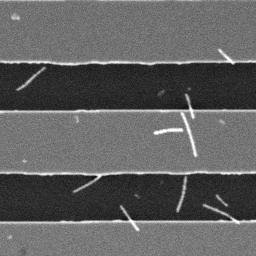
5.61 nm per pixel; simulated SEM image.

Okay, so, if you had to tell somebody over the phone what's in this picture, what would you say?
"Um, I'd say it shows lines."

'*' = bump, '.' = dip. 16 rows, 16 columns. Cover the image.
****************
****************
****************
****************
................
................
................
****************
****************
****************
****************
................
................
................
****************
****************